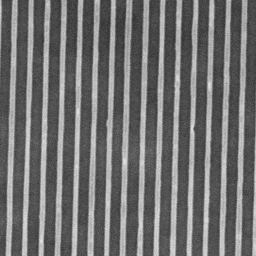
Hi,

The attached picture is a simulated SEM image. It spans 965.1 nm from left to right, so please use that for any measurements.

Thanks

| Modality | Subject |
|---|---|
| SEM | parallel lines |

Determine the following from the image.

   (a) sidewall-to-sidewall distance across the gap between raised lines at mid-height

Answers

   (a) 45.3 nanometers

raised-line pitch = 16.4 pixels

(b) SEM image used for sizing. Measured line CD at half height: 0.0174 micrometres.